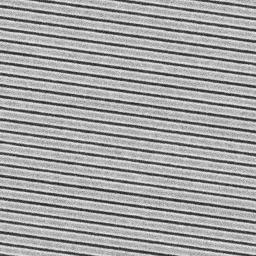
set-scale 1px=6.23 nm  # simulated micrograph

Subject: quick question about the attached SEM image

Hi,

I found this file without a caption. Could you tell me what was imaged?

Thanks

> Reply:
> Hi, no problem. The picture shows parallel lines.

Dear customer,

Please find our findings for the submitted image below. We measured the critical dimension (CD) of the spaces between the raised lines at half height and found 0.0216 micrometres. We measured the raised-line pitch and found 0.0698 microns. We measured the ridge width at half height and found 47.8 nm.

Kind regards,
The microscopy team